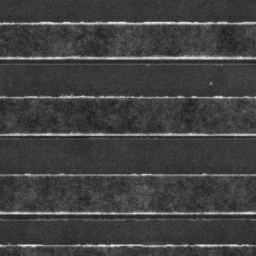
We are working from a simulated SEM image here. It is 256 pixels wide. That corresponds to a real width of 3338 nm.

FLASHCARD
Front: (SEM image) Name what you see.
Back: lines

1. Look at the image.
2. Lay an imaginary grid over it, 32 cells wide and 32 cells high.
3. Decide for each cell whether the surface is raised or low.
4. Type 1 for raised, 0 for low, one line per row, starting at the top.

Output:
00000000000000000000000000000000
00000000000000000000000000000000
00000000000000000000000000000000
11111111111111111111111111111111
11111111111111111111111111111111
11111111111111111111111111111111
11111111111111111111111111111111
00000000000000000000000000000000
00000000000000000000000000000000
00000000000000000000000000000000
00000000000000000000000000000000
00000000000000000000000000000000
11111111111111111111111111111111
11111111111111111111111111111111
11111111111111111111111111111111
11111111111111111111111111111111
11111111111111111111111111111111
00000000000000000000000000000000
00000000000000000000000000000000
00000000000000000000000000000000
00000000000000000000000000000000
00000000000000000000000000000000
11111111111111111111111111111111
11111111111111111111111111111111
11111111111111111111111111111111
11111111111111111111111111111111
11111111111111111111111111111111
00000000000000000000000000000000
00000000000000000000000000000000
00000000000000000000000000000000
00000000000000000000000000000000
11111111111111111111111111111111